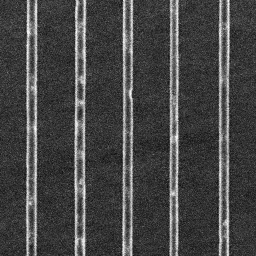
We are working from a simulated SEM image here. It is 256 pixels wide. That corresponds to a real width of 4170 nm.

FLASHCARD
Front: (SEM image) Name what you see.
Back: parallel lines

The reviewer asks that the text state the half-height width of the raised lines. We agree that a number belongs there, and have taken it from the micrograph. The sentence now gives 153 nanometres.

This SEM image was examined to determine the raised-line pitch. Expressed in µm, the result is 0.783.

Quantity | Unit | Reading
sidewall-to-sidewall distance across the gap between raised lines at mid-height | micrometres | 0.633